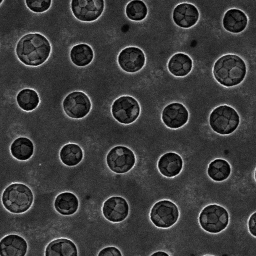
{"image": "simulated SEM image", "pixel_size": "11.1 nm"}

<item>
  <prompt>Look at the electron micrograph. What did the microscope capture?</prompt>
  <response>a regular array of holes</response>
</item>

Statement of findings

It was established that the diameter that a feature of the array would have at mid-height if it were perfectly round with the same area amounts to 0.285 µm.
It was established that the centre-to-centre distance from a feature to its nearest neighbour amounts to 0.545 microns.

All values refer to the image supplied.